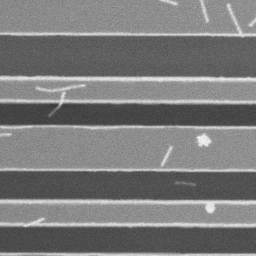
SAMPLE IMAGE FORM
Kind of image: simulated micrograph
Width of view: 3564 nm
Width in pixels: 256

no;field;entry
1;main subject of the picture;lines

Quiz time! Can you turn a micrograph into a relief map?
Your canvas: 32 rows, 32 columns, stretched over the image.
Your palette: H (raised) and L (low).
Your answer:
HHHHHHHHHHHHHHHHHHHHHHHHHHHHHHHH
HHHHHHHHHHHHHHHHHHHHHHHHHHHHHHHH
HHHHHHHHHHHHHHHHHHHHHHHHHHHHHHHH
HHHHHHHHHHHHHHHHHHHHHHHHHHHHHHHH
LLLLLLLLLLLLLLLLLLLLLLLLLLLLLLLL
LLLLLLLLLLLLLLLLLLLLLLLLLLLLLLLL
LLLLLLLLLLLLLLLLLLLLLLLLLLLLLLLL
LLLLLLLLLLLLLLLLLLLLLLLLLLLLLLLL
LLLLLLLLLLLLLLLLLLLLLLLLLLLLLLLL
LLLLLLLLLLLLLLLLLLLLLLLLLLLLLLLL
HHHHHHHHHHHHHHHHHHHHHHHHHHHHHHHH
HHHHHHHHHHHHHHHHHHHHHHHHHHHHHHHH
HHHHHHHHHHHHHHHHHHHHHHHHHHHHHHHH
LLLLLLLLLLLLLLLLLLLLLLLLLLLLLLLL
LLLLLLLLLLLLLLLLLLLLLLLLLLLLLLLL
LLLLLLLLLLLLLLLLLLLLLLLLLLLLLLLL
HHHHHHHHHHHHHHHHHHHHHHHHHHHHHHHH
HHHHHHHHHHHHHHHHHHHHHHHHHHHHHHHH
HHHHHHHHHHHHHHHHHHHHHHHHHHHHHHHH
HHHHHHHHHHHHHHHHHHHHHHHHHHHHHHHH
HHHHHHHHHHHHHHHHHHHHHHHHHHHHHHHH
LLLLLLLLLLLLLLLLLLLLLLLLLLLLLLLL
LLLLLLLLLLLLLLLLLLLLLLLLLLLLLLLL
LLLLLLLLLLLLLLLLLLLLLLLLLLLLLLLL
LLLLLLLLLLLLLLLLLLLLLLLLLLLLLLLL
HHHHHHHHHHHHHHHHHHHHHHHHHHHHHHHH
HHHHHHHHHHHHHHHHHHHHHHHHHHHHHHHH
HHHHHHHHHHHHHHHHHHHHHHHHHHHHHHHH
LLLLLLLLLLLLLLLLLLLLLLLLLLLLLLLL
LLLLLLLLLLLLLLLLLLLLLLLLLLLLLLLL
LLLLLLLLLLLLLLLLLLLLLLLLLLLLLLLL
LLLLLLLLLLLLLLLLLLLLLLLLLLLLLLLL